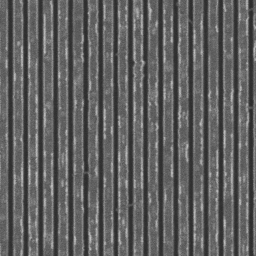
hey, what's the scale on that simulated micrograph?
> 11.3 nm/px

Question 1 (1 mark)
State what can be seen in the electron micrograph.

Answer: parallel lines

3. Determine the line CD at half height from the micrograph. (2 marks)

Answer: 114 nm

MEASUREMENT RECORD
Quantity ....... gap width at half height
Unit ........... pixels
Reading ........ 5.5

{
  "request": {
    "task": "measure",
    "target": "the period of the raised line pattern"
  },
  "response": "170 nanometers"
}